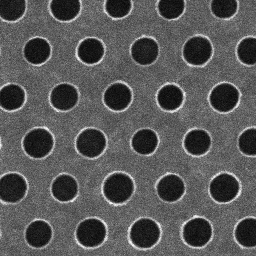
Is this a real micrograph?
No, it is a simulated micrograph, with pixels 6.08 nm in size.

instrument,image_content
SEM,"a regular array of holes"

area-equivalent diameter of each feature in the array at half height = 27.5 pixels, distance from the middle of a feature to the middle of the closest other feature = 317 nm